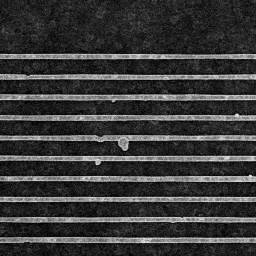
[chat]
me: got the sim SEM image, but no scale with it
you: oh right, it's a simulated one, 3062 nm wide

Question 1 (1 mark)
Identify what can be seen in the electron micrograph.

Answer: parallel lines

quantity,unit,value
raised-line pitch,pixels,20.4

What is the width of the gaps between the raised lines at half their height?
191 nm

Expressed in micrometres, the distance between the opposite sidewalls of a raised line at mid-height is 0.0538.